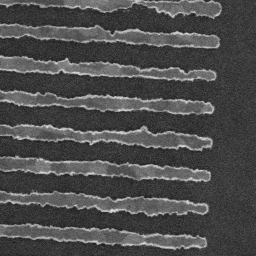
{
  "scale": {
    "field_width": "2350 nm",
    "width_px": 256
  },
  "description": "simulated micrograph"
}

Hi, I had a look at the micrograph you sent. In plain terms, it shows parallel lines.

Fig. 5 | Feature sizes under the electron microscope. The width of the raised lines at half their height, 109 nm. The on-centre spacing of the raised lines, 306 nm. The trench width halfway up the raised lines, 192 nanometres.